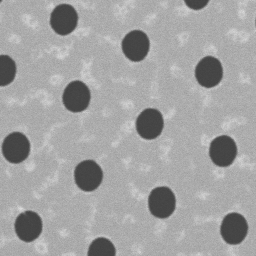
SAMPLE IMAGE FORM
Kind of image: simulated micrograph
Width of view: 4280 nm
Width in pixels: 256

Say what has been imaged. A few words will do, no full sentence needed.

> a regular array of holes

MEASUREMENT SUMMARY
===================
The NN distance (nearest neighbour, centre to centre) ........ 1300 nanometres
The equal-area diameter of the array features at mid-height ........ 510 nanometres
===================